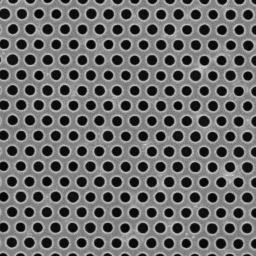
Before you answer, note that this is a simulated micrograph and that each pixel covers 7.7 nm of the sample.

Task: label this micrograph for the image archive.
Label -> a regular array of holes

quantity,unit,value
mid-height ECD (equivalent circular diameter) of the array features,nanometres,79.6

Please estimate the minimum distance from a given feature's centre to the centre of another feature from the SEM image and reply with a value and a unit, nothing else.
0.132 microns